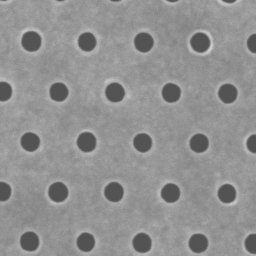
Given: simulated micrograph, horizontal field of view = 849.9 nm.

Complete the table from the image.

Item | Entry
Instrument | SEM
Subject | a regular array of holes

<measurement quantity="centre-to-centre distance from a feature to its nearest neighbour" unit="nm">187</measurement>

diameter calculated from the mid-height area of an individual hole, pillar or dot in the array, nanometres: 65.5